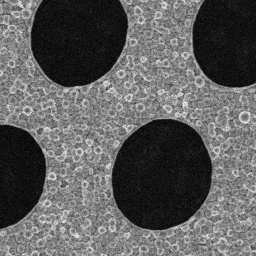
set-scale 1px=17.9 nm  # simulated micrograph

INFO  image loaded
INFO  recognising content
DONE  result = holes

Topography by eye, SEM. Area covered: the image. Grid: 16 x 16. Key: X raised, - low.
XX------XXXX----
XX------XXXX----
XX------XXXX----
XX-----XXXXX----
XXX----XXXXXX---
XXXXXXXXXXXXXXXX
XXXXXXXXXXXXXXXX
XXXXXXXXXX-XXXXX
--XXXXXX-----XXX
---XXXX------XXX
---XXXX------XXX
---XXXX------XXX
--XXXXX------XXX
--XXXXXX----XXXX
XXXXXXXXXXXXXXXX
XXXXXXXXXXXXXXXX